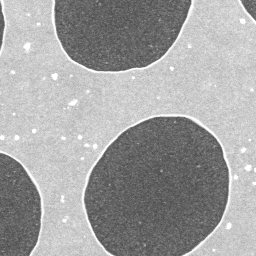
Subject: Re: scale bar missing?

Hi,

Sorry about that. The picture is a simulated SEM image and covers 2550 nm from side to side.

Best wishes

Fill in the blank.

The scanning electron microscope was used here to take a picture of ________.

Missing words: holes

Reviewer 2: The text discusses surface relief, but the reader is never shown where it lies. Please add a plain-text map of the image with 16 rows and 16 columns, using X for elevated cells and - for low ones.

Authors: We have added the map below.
XXX---------XXX-
XXX--------XXXXX
XXXX-------XXXXX
XXXX------XXXXXX
XXXXXXXXXXXXXXXX
XXXXXXXXXXXXXXXX
XXXXXXXXXXXXXXXX
XXXXXXXXX---XXXX
XXXXXXX------XXX
XXXXXXX-------XX
--XXXX--------XX
--XXX---------XX
---XX---------XX
---XX---------XX
--XXXX-------XXX
--XXXXX-----XXXX